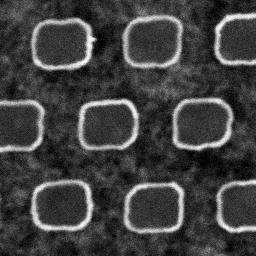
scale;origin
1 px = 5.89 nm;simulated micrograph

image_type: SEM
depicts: raised bodies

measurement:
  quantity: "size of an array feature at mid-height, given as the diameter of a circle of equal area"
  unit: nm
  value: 331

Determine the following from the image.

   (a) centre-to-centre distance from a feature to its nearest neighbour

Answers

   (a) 0.543 microns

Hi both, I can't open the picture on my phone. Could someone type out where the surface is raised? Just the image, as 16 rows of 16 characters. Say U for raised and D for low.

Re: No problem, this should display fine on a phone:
DDDDDDDDDDDDDDDD
DDDUUDDDUUUDDDUU
DDUUUUDDUUUDDDUU
DDUUUUDDUUUDDDUU
DDDDDDDDDDDDDDDD
DDDDDDDDDDDDDDDD
UUDDDDUUDDDUUUDD
UUUDDUUUUDDUUUDD
UUUDDUUUDDDUUUDD
DDDDDDDDDDDDDDDD
DDDDDDDDDDDDDDDD
DDDUUDDDDDUDDDDU
DDUUUUDDUUUDDDUU
DDUUUUDDUUUDDDUU
DDDDDDDDDDDDDDDD
DDDDDDDDDDDDDDDD